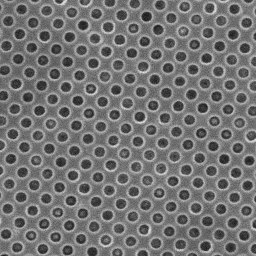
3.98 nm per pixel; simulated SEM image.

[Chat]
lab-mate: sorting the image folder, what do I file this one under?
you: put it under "a regular array of holes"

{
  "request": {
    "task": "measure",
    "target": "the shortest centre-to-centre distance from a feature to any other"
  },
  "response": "69 nm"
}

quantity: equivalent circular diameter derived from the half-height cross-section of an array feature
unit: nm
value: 42.3